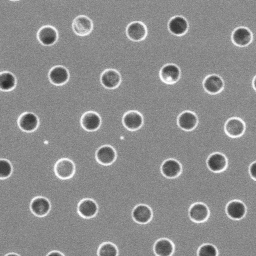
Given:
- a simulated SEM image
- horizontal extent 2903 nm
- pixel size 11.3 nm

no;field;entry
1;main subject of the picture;a regular array of raised bodies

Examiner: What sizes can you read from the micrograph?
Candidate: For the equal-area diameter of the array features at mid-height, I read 0.226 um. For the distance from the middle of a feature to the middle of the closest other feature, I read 477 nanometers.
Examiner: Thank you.